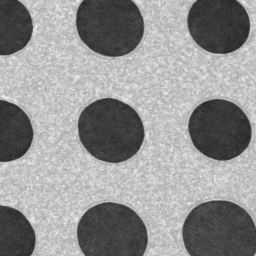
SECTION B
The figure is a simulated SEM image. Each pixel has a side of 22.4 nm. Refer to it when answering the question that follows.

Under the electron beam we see holes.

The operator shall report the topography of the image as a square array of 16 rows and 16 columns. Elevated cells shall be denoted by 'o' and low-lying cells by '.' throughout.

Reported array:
..ooo....ooo...o
..ooo....ooo....
..ooo....ooo...o
oooooo..oooooooo
oooooooooooooooo
oooooooooooooooo
.ooooo..ooooo..o
..ooo....ooo....
..ooo....ooo....
..oooo...oooo..o
oooooooooooooooo
oooooooooooooooo
oooooooooooooooo
..ooo....ooo....
..ooo....oo.....
..ooo....ooo....